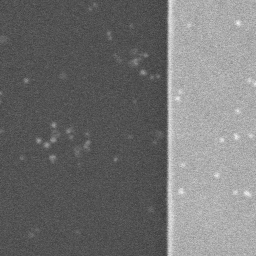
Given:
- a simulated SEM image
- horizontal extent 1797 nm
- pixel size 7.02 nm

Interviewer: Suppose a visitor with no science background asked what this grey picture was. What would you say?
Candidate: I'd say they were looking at wiring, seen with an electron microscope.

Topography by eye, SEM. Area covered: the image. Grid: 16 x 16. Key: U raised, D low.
DDDDDDDDDDDUUUUU
DDDDDDDDDDDUUUUU
DDDDDDDDDDDUUUUU
DDDDDDDDDDDUUUUU
DDDDDDDDDDDUUUUU
DDDDDDDDDDDUUUUU
DDDDDDDDDDDUUUUU
DDDDDDDDDDDUUUUU
DDDDDDDDDDDUUUUU
DDDDDDDDDDDUUUUU
DDDDDDDDDDDUUUUU
DDDDDDDDDDDUUUUU
DDDDDDDDDDDUUUUU
DDDDDDDDDDDUUUUU
DDDDDDDDDDDUUUUU
DDDDDDDDDDDUUUUU